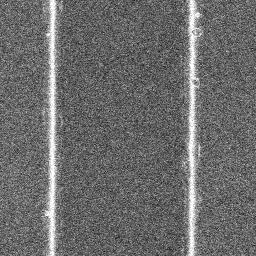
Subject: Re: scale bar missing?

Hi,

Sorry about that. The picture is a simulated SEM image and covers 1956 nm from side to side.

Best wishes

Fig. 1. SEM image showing one or a few lines or trenches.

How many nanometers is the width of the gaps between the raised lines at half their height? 1060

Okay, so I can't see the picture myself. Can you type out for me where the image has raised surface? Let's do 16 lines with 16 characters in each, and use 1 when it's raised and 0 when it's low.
1110000000001111
1110000000001111
1110000000001111
1110000000001111
1110000000001111
1110000000001111
1110000000001111
1110000000001111
1110000000001111
1110000000001111
1110000000001111
1110000000001111
1110000000001111
1110000000001111
1110000000001111
1110000000001111